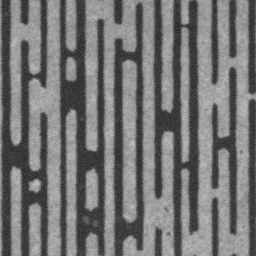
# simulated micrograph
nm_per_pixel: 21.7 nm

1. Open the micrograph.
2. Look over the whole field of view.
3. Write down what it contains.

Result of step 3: parallel lines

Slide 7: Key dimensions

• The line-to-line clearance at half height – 0.19 microns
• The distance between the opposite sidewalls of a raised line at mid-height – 222 nanometres